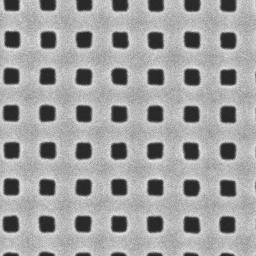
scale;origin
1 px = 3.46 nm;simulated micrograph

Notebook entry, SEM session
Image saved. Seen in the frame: a regular array of holes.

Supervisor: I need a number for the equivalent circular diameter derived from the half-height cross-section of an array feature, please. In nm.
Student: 62.6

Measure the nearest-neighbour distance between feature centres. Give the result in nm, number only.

124